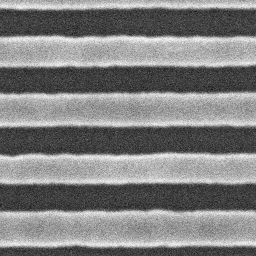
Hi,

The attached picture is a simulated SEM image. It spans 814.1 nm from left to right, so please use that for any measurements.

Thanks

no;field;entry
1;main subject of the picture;lines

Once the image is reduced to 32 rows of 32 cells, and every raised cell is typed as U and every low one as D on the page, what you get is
UUUUUUUUUUUUUUUUUUUUUUUUUUUUUUUU
DDDDDDDDDDDDDDDDDDDDDDDDDDDDDDDD
DDDDDDDDDDDDDDDDDDDDDDDDDDDDDDDD
DDDDDDDDDDDDDDDDDDDDDDDDDDDDDDDD
DDDDDDDDDDDDDDDDDDDDDDDDDDDDDDDD
UUUUUUUUUUUUUUUUUUUUUUUUUUUUUUUU
UUUUUUUUUUUUUUUUUUUUUUUUUUUUUUUU
UUUUUUUUUUUUUUUUUUUUUUUUUUUUUUUU
DDDDDDDDDDDDDDDDDDDDDDDDDDDDDDDD
DDDDDDDDDDDDDDDDDDDDDDDDDDDDDDDD
DDDDDDDDDDDDDDDDDDDDDDDDDDDDDDDD
DDDDDDDDDDDDDDDDDDDDDDDDDDDDDDDD
UUUUUUUUUUUUUUUUUUUUUUUUUUUUUUUU
UUUUUUUUUUUUUUUUUUUUUUUUUUUUUUUU
UUUUUUUUUUUUUUUUUUUUUUUUUUUUUUUU
UUUUUUUUUUUUUUUUUUUUUUUUUUUUUUUU
DDDDDDDDDDDDDDDDDDDDDDDDDDDDDDDD
DDDDDDDDDDDDDDDDDDDDDDDDDDDDDDDD
DDDDDDDDDDDDDDDDDDDDDDDDDDDDDDDD
DDDUUUDUUUUUDDDDDDUUUUUUUUUUUUUU
UUUUUUUUUUUUUUUUUUUUUUUUUUUUUUUU
UUUUUUUUUUUUUUUUUUUUUUUUUUUUUUUU
UUUUUUUUUUUUUUUUUUUUUUUUUUUUUUUU
DDDDDDDDDDDDDDDDDDDDDDDDDDDDDDDD
DDDDDDDDDDDDDDDDDDDDDDDDDDDDDDDD
DDDDDDDDDDDDDDDDDDDDDDDDDDDDDDDD
DDDDDUUUDDUUUDDUUUUUUUDUUUUUUUUU
UUUUUUUUUUUUUUUUUUUUUUUUUUUUUUUU
UUUUUUUUUUUUUUUUUUUUUUUUUUUUUUUU
UUUUUUUUUUUUUUUUUUUUUUUUUUUUUUUU
UUUUUUUUUUUUUUUUUUUUUUUUUUUUUUUU
DDDDDDDDDDDDDDDDDDDDDDDDDDDDDDDD